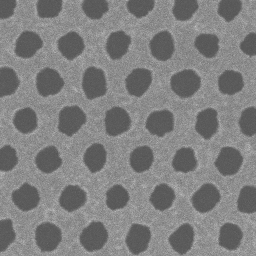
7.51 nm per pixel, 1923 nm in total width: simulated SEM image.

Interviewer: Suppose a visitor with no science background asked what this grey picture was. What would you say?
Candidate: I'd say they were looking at a regular array of holes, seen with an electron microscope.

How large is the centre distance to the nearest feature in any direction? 327 nm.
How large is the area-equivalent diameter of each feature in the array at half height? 0.205 microns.